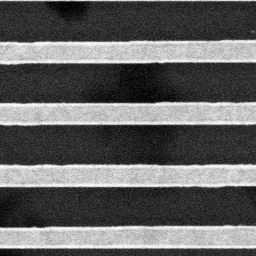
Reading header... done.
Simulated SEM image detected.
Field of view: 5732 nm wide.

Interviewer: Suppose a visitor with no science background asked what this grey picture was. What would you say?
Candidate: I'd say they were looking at lines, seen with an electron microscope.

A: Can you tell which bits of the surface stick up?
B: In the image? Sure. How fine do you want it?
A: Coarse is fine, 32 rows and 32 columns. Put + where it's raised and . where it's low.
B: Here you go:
................................
................................
................................
................................
................................
++++++++++++++++++++++++++++++++
++++++++++++++++++++++++++++++++
++++++++++++++++++++++++++++++++
................................
................................
................................
................................
................................
++++++++++++++++++++++++++++++++
++++++++++++++++++++++++++++++++
....+...........................
................................
................................
................................
................................
................................
++++++++++++++++++++++++++++++++
++++++++++++++++++++++++++++++++
................................
................................
................................
................................
................................
......++++++++++++++++++++++++++
++++++++++++++++++++++++++++++++
++++++++++++++++++++++++++++++++
................................